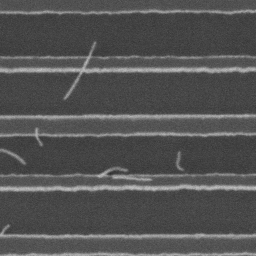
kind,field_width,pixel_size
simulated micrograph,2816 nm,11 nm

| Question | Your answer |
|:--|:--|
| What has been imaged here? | lines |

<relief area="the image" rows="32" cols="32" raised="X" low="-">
XXXXXXXXXXXXXXXXXXXXXXXXXXXXXXXX
XXXXXXXXXXXXXXXXX---X------XXX--
--------------------------------
--------------------------------
--------------------------------
--------------------------------
--------------------------------
XXXXXXXXXXXXXXXXXXXXXXXXXXXXXXXX
XXXXXXXXXXXXXXXXXXXXXXXXXXXXXXXX
--------------------------------
--------------------------------
--------------------------------
--------------------------------
--------------------------------
----------XXXXXX-XXXXXXXXXXXXXXX
XXXXXXXXXXXXXXXXXXXXXXXXXXXXXXXX
XXXXXXXXXXXXXXXXXXXXXXXXXXXXXXXX
--------------------------------
--------------------------------
--------------------------------
--------------------------------
--------------------------------
XXXXXXXXXXXXXXXXXXXXXXXXXXXXXXXX
XXXXXXXXXXXXXXXX-XXXXX--XXX--XXX
--------------------------------
--------------------------------
--------------------------------
--------------------------------
--------------------------------
XXXXXX-XX--XXXXXXXXXXXXXXXXXXXXX
XXXXXXXXXXXXXXXXXXXXXXXXXXXXXXXX
XXXXXXXXXXXXXXXXXXXXXXXXXXXXXXXX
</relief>